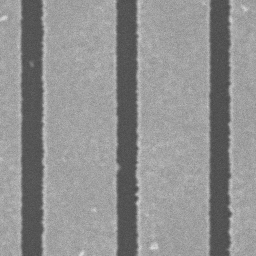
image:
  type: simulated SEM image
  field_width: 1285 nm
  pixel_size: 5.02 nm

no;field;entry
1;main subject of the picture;lines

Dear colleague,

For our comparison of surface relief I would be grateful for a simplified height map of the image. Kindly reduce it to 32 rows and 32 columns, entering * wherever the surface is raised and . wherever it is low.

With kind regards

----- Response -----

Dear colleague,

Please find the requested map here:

***..*********...*********...***
***..**********..*********...***
***..**********..*********...***
***..**********..*********...***
***..**********..*********...***
***..**********..*********...***
***..*********...*********...***
***..**********..*********...***
***..**********..*********...***
***..**********..*********...***
***..**********..*********...***
***..**********..*********...***
***..**********..*********...***
***..**********..*********...***
***..**********..*********...***
***..**********..*********...***
***..**********..*********...***
***..**********..*********...***
***..**********..*********...***
***..**********..*********...***
***..**********..*********...***
***..**********..*********...***
***..**********..*********...***
***..**********..*********...***
***..**********..*********...***
***..**********..*********...***
***..**********..*********...***
***..**********..*********...***
***..**********..*********...***
***..**********..*********...***
***..**********..*********...***
***..**********..*********...***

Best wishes